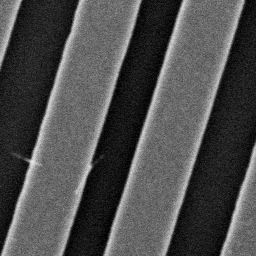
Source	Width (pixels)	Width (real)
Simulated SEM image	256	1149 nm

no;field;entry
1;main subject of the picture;lines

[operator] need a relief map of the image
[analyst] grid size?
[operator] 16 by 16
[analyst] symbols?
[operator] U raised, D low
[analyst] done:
UDDDDUUUUDDUUUUD
UDDDDUUUDDDUUUUD
UDDDUUUUDDDUUUUD
DDDDUUUUDDUUUUDD
DDDDUUUDDDUUUUDD
DDDUUUUDDDUUUUDD
DDDUUUUDDUUUUDDD
DDDUUUUDDUUUUDDD
DDUUUUDDDUUUUDDD
DDUUUUDDUUUUDDDD
DDUUUUDDUUUUDDDD
DDUUUDDDUUUUDDDU
DUUUUDDDUUUDDDDU
DUUUUDDUUUUDDDDU
DUUUDDDUUUUDDDUU
UUUUDDDUUUDDDDUU